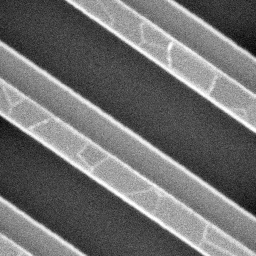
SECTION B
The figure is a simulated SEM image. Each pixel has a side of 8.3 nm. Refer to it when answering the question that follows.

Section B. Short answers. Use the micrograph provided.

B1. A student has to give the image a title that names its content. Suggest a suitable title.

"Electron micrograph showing lines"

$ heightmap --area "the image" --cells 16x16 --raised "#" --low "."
.....######.....
......#######...
........######..
#........#######
###........#####
####........####
######.......###
.######........#
..######........
...#######......
.....######.....
......#######...
........######..
##.......#######
###........#####
####........####